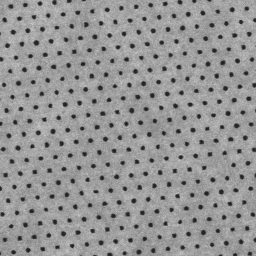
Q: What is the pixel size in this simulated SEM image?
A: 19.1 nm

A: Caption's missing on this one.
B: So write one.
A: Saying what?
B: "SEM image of a regular array of holes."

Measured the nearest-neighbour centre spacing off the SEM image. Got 274 nanometers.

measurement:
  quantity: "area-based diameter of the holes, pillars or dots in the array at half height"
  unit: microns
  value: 0.094